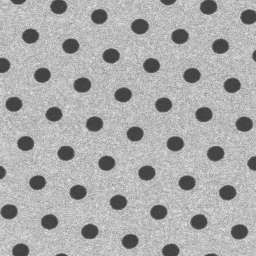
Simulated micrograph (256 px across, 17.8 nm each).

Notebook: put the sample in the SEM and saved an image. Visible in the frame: a regular array of holes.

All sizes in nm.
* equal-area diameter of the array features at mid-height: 282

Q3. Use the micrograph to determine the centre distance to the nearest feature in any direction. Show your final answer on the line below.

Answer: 40.7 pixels